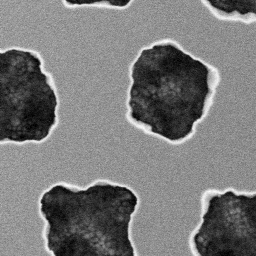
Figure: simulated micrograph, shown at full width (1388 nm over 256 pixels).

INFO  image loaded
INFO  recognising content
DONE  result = holes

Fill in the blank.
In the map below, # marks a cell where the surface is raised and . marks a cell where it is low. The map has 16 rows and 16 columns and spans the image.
#############...
################
################
..#######...####
...#####.....###
...#####.....###
....####.....###
...#####....####
...#######..####
################
################
######.#########
###.....#####...
###.....#####...
###.....####....
###.....####....